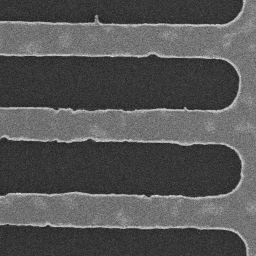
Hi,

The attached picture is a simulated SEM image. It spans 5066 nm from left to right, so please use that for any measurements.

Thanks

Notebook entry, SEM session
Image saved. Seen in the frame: one or a few lines or trenches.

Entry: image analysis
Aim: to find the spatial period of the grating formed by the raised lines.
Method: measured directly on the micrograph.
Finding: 1690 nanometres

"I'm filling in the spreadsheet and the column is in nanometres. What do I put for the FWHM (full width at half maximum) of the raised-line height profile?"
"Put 631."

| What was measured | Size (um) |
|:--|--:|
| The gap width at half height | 1.06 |